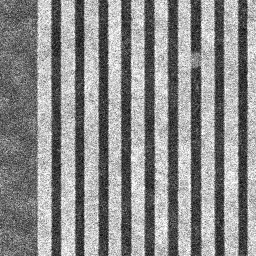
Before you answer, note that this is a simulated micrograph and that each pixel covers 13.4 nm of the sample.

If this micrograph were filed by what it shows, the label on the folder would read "parallel lines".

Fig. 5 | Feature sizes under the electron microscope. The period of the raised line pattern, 312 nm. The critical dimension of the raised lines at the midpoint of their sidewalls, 0.186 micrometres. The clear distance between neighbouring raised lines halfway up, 10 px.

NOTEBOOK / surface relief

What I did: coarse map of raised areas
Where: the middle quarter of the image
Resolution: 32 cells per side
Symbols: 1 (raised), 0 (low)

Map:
11100111000111000111000111000110
11100111000111000111000111000110
11100111000111000111000111000110
11100111000111000111000111000110
11100111000111000111000111000110
11100111000111000111000111000110
11100111000111000111000111000110
11100111000111000111000111000110
11100111000111000111000111000110
11100111000111000111000111000110
11100111000111000111000111000110
11100111000111000111000111000110
11100111000111000111000111000110
11100111000111000111000111000110
11100111000111000111000111000110
11100111000111000111000111000110
11100111000111000111000111000110
11100111000111000111000111000110
11100111000111000111000111000110
11100111000111000111000111000110
11100111000111000111000111000110
11100111000111000111000111000110
11100111000111000111000111000110
11100111000111000111000111000110
11100111000111000111000111000110
11100111000111000111000111000110
11100111000111000111000111000110
11100111000111000111000111000110
11100111000111000111000111000110
11100111000111000111000111000110
11100111000111000111000111000110
11100111000111000111000111000110